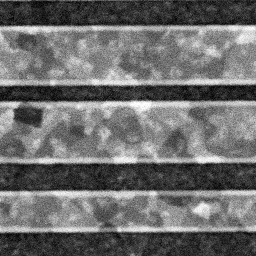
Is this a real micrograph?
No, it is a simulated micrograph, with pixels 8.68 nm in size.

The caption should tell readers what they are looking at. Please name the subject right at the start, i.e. one or a few lines or trenches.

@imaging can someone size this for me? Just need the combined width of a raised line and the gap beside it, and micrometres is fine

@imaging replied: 0.677